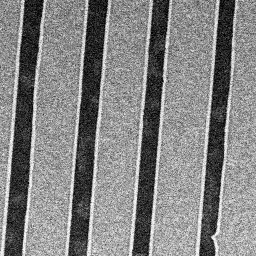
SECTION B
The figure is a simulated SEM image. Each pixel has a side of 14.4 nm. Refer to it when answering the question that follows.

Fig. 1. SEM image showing one or a few lines or trenches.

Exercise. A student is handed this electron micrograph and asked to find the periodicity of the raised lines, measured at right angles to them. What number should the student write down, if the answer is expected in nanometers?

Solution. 922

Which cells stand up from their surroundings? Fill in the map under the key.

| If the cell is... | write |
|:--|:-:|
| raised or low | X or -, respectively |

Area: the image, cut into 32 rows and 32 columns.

XXX---XXXXX---XXXXX--XXXXXX---XX
XXX---XXXXX---XXXXX--XXXXXX--XXX
XXX--XXXXXX---XXXXX--XXXXXX--XXX
XX---XXXXXX--XXXXXX--XXXXXX--XXX
XX---XXXXX---XXXXX---XXXXXX--XXX
XX---XXXXX---XXXXX---XXXXXX--XXX
XX---XXXXX---XXXXX---XXXXXX--XXX
XX---XXXXX---XXXXX---XXXXXX--XXX
XX---XXXXX---XXXXX---XXXXXX--XXX
XX---XXXXX---XXXXX---XXXXX---XXX
XX---XXXXX---XXXXX---XXXXX---XXX
XX---XXXXX---XXXXX--XXXXXX---XXX
XX--XXXXXX---XXXXX--XXXXXX---XXX
XX--XXXXXX---XXXXX--XXXXXX---XXX
XX--XXXXXX--XXXXXX--XXXXXX---XXX
XX--XXXXXX--XXXXXX--XXXXXX--XXXX
XX--XXXXXX--XXXXX---XXXXXX--XXXX
X---XXXXX---XXXXX---XXXXXX--XXXX
X---XXXXX---XXXXX---XXXXXX--XXXX
X---XXXXX---XXXXX---XXXXXX--XXXX
X---XXXXX---XXXXX---XXXXXX--XXXX
X---XXXXX---XXXXX---XXXXX---XXXX
X---XXXXX---XXXXX---XXXXX---XXXX
X---XXXXX---XXXXX---XXXXX---XXXX
X---XXXXX---XXXXX--XXXXXX---XXXX
X---XXXXX---XXXXX--XXXXXX---XXXX
X---XXXXX---XXXXX--XXXXXX---XXXX
X--XXXXXX--XXXXXX--XXXXXX--XXXXX
---XXXXXX--XXXXXX--XXXXXX--XXXXX
---XXXXX---XXXXX---XXXXXX--XXXXX
---XXXXX---XXXXX---XXXXXX--XXXXX
---XXXXX---XXXXX---XXXXXX--XXXXX